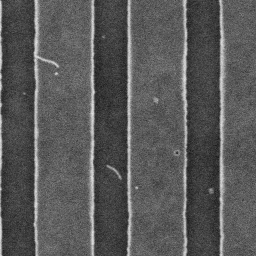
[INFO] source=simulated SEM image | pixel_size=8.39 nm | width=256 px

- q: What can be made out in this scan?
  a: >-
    lines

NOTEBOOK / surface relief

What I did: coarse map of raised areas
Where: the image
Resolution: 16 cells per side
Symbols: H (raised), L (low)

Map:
LLHHHHLLHHHHLLHH
LLHHHHLLHHHHLLHH
LLHHHHLLHHHHLLHH
LLHHHHLLHHHHLLHH
LLHHHHLLHHHHLLHH
LLHHHHLLHHHHLLHH
LLHHHHLLHHHHLLHH
LLHHHHLLHHHHLLHH
LLHHHHLLHHHHLLHH
LLHHHHLLHHHHLLHH
LLHHHHLLHHHHLLHH
LLHHHHLLHHHHLLHH
LLHHHHLLHHHHLLHH
LLHHHHLLHHHHLLHH
LLHHHHLLHHHHLLHH
LLHHHHLLHHHHLLHH